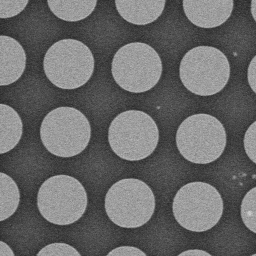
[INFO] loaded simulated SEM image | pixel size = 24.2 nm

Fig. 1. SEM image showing an array of small figures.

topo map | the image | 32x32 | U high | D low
UUUDDDUUUUUUDDUUUUUUDDDUUUUUUDDU
UUDDDDDUUUUDDDDUUUUUDDDUUUUUUDDU
DDDDDDDDUUDDDDDDUUUDDDDDUUUUDDDD
DDDDDDDDDDDDDDDDDDDDDDDDDDDDDDDD
DDDDDDDDDDDDDDDDDDDDDDDDDDDDDDDD
UUDDDDDUUUDDDDDDUUDDDDDDDDDDDDDD
UUUDDDUUUUUDDDDUUUUDDDDDUUUUDDDD
UUUDDDUUUUUUDDUUUUUUDDDUUUUUDDDD
UUUDDDUUUUUUDDUUUUUUDDUUUUUUUDDU
UUDDDDUUUUUDDDUUUUUUDDDUUUUUUDDU
UDDDDDDUUUDDDDDUUUUDDDDUUUUUDDDU
DDDDDDDDDDDDDDDDDDDDDDDDUUUDDDDD
DDDDDDDDDDDDDDDDDDDDDDDDDDDDDDDD
UDDDDDDUUDDDDDDDDDDDDDDDDDDDDDDD
UUDDDDUUUUDDDDDUUUUDDDDDUUDDDDDD
UUUDDUUUUUUDDDUUUUUDDDDUUUUUDDDD
UUUDDUUUUUUDDDUUUUUUDDUUUUUUDDDU
UUDDDUUUUUUDDDUUUUUUDDUUUUUUDDDU
UUDDDDUUUUUDDDUUUUUDDDUUUUUUDDDU
DDDDDDDUUDDDDDDUUUDDDDDUUUUDDDDU
DDDDDDDDDDDDDDDDDDDDDDDDDDDDDDDD
DDDDDDDDDDDDDDDDDDDDDDDDDDDDDDDD
UUDDDDUUUDDDDDDUUDDDDDDDDDDDDDDD
UUDDDUUUUUDDDDUUUUUDDDDUUUUDDDDD
UUDDDUUUUUUDDUUUUUUDDDUUUUUDDDDU
UUDDDUUUUUUDDUUUUUUDDDUUUUUUDDUU
UUDDDUUUUUDDDUUUUUUDDDUUUUUUDDUU
DDDDDDUUUUDDDDUUUUUDDDUUUUUDDDUU
DDDDDDDDDDDDDDDDDDDDDDDUUUDDDDDU
DDDDDDDDDDDDDDDDDDDDDDDDDDDDDDDD
UDDDDDDUDDDDDDDDDDDDDDDDDDDDDDDD
UUDDDUUUUUDDDDUUUUDDDDDUUUDDDDDD